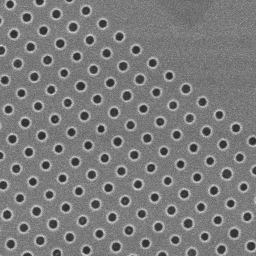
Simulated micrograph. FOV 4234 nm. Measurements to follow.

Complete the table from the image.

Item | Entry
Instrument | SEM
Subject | a regular array of holes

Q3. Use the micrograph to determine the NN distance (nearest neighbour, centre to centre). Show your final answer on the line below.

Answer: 344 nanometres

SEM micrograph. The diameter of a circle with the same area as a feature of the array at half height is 143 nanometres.